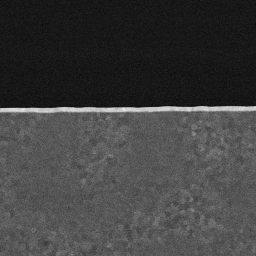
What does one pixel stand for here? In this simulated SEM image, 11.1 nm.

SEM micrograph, wiring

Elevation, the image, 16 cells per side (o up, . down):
................
................
................
................
................
................
................
oooooooooooooooo
oooooooooooooooo
oooooooooooooooo
oooooooooooooooo
oooooooooooooooo
oooooooooooooooo
oooooooooooooooo
oooooooooooooooo
oooooooooooooooo